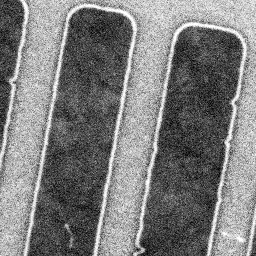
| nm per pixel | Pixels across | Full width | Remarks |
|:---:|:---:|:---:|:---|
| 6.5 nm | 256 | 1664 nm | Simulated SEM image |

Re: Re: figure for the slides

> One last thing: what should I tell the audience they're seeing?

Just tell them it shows one or a few lines or trenches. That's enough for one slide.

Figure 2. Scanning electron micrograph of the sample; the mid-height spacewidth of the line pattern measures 258 nm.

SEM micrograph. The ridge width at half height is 0.45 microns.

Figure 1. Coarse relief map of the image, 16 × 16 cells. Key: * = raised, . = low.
**...*..........
**..****........
*...****...****.
*...****...****.
*...****...****.
*..*****..*****.
*..*****..*****.
...****...*****.
...****...****..
...****...****..
...****..*****..
..*****..*****..
..*****..*****..
..****...****...
..****...****...
..****...****...